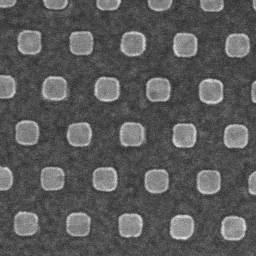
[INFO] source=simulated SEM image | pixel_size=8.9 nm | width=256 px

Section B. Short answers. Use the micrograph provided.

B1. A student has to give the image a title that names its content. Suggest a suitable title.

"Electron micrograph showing a regular array of raised bodies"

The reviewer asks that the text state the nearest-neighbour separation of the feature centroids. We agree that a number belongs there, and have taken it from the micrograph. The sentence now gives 460 nanometers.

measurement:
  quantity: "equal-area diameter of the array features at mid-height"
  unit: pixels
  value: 24.4